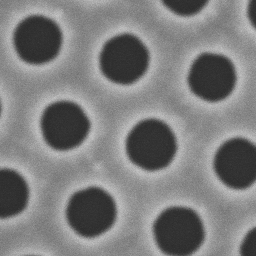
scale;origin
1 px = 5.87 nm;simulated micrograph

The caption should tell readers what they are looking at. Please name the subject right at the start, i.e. holes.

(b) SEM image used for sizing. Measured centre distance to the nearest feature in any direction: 522 nm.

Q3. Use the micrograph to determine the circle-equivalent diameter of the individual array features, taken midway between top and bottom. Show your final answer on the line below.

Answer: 300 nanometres